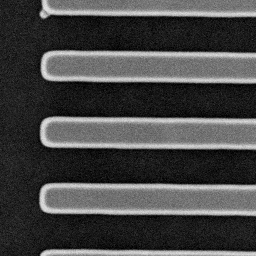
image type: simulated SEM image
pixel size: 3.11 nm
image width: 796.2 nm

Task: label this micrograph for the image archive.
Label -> groups of lines, slits or small figures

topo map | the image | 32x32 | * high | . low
.....***************************
......**************************
................................
................................
................................
................................
................................
.....***************************
.....***************************
......**************************
................................
................................
................................
................................
................................
.....***************************
.....***************************
.....***************************
................................
................................
................................
................................
................................
......**************************
.....***************************
.....***************************
.......*************************
................................
................................
................................
................................
......********..**..............